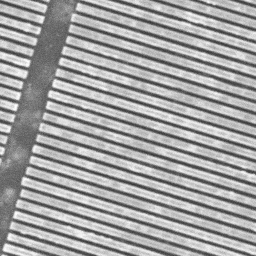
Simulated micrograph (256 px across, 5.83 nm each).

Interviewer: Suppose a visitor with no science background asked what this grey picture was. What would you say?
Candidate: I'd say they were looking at parallel lines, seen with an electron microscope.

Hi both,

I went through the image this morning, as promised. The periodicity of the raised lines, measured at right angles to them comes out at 66.6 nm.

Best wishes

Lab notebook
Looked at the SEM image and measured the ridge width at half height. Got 0.0377 micrometres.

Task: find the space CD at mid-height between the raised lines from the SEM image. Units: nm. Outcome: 26.5